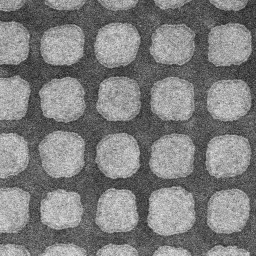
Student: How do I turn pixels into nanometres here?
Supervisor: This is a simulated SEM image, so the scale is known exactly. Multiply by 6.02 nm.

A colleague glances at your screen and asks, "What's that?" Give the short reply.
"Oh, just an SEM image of a regular array of raised bodies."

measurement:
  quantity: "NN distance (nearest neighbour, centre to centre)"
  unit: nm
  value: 328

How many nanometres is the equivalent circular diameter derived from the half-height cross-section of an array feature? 268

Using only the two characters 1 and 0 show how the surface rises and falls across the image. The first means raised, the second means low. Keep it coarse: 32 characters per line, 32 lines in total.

11100011110001111000111000011110
00000000000000000000000000000000
00000000000000000000000000000000
11100001110001111000111100011110
11110111110011111001111100111110
11100111110011111001111100111110
11100111110011111001111100111110
11100011110011111000111100111110
00000000000000000000000000000000
00000000000000000000000000000000
11100011110001111001111100011110
11110111110011111001111100111110
11100111110011111001111100111110
11100111110011111001111100111110
11100011110001111000111100011100
00000000000000000000000000000000
00000001000000000000000000000000
11100111110001111000111100011110
11100111110011111001111100111110
11110111110011111001111100111110
11100111110011111001111100111110
11000011110001111001111100111100
00000000000000000000000000000000
01000000000000000000011000000000
11110011110001111001111100011110
11110111110011111001111100111110
11110111110011111001111100111110
11110111110011111001111100111110
11100001000001111001111100111100
00000000000000000000000000000000
00000000100000000000000000000000
11100111111011111001111000111110